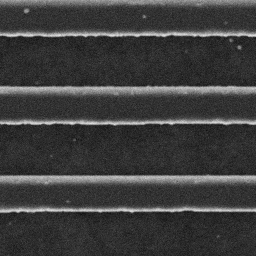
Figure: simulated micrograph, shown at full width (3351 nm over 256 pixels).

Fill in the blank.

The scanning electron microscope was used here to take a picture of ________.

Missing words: lines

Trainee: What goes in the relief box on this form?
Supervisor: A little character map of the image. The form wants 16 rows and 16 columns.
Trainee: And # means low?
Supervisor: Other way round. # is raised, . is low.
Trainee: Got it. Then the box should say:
################
################
................
................
................
................
################
################
................
................
................
################
################
................
................
................